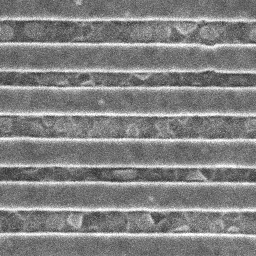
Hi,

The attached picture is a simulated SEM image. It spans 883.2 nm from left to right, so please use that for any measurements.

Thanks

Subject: parallel lines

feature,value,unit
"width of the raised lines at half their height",94.1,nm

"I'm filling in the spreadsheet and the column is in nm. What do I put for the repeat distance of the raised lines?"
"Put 159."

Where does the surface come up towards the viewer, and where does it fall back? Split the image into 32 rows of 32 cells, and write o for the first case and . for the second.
oooooooooooooooooooooooooooooooo
oooooooooooooooooooooooooooooooo
...oo...oooooo........o.oooooooo
....o..................o........
o................o..............
oooooo...........o.oo...........
oooooooooooooooooooooooooooooooo
oooooooooooooooooooooooooooooooo
oooooooooooooooooooooooooooooooo
................................
................................
oooooooooooooooooooooooooooooooo
oooooooooooooooooooooooooooooooo
oooooooooooooooooooooooooooooooo
o..............................o
................................
................................
oooooooooooooooooooooooo.....oo.
oooooooooooooooooooooooooooooooo
oooooooooooooooooooooooooooooooo
oooooooooooooooooooooooooooooooo
..............ooo...............
........................o.......
oooooooooooooooooooooooooooooooo
oooooooooooooooooooooooooooooooo
oooooooooooooooooooooooooooooooo
................................
.........o........o.............
................................
oooooooooooooooooooooooooooooooo
oooooooooooooooooooooooooooooooo
oooooooooooooooooooooooooooooooo